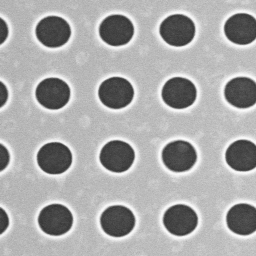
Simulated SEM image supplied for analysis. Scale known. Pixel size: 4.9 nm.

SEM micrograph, a regular array of holes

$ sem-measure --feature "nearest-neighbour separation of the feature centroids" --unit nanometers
303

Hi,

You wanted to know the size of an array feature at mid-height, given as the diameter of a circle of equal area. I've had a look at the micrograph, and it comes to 34.1 pixels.